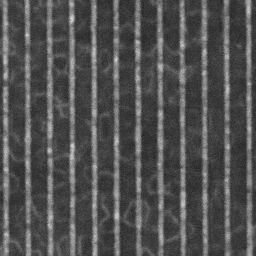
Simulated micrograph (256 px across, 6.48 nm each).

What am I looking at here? parallel lines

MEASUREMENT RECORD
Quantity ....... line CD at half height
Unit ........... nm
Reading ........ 18.6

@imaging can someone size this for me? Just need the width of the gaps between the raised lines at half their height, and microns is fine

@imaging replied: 0.124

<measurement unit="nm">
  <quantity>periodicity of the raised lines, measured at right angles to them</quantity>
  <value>143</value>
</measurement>